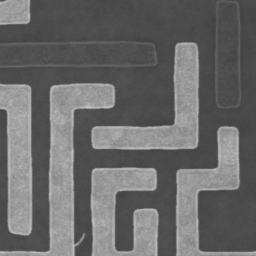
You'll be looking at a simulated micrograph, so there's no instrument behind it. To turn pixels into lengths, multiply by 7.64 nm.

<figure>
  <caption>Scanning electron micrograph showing wiring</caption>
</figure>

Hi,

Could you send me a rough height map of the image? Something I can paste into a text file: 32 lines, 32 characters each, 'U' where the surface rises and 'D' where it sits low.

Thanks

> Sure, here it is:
UUUUDDDDDDDDDDDDDDDDDDDDDDDUUUDD
UUUUDDDDDDDDDDDDDDDDDDDDDDDUUUDD
UUUUDDDDDDDDDDDDDDDDDDDDDDDUUUDD
DDDDDDDDDDDDDDDDDDDDDDDDDDDUUUDD
DDDDDDDDDDDDDDDDDDDDDDDDDDDUUUDD
DDUUUUUUUUUUUUUUUUUDDDDUDDDUUUDD
UUUUUUUUUUUUUUUUUUUDDDUUUDDUUUDD
UUUUUUUUUUUUUUUUUUUUDDUUUDDUUUDD
DDDDDDDDDDDDDDDDDDDDDDUUUDDUUUDD
DDDDDDDDDDDDDDDDDDDDDDUUUDDUUUDD
DDDDDDDDDDDDDDDDDDDDDDUUUDDUUUDD
UUUUDDUUUUUUUUDDDDDDDDUUUDDUUUDD
UUUUDDUUUUUUUUDDDDDDDDUUUDDUUUDD
UUUUDDUUUUDDDDDDDDDDDDUUUDDDDDDD
DUUUDDUUUDDDDDDDDDDDDDUUUDDDDDDD
DUUUDDUUUDDDDDDDDDDDDDUUUDDDDDDD
DUUUDDUUUDDDUUUUUUUUUUUUUDDUUUDD
DUUUDDUUUDDDUUUUUUUUUUUUUDDUUUDD
DUUUDDUUUDDDUUUUUUUUUUUUDDDUUUDD
DUUUDDUUUDDDDDDDDDDDDDDDDDDUUUDD
DUUUDDUUUDDDDDDDDDDDDDDDDDDUUUDD
DUUUDDUUUDDDUUUUUUUDDDUUUUUUUUDD
DUUUDDUUUDDDUUUUUUUUDDUUUUUUUUDD
DUUUDDUUUDDDUUUUUUUDDDUUUUUUUUDD
DUUUDDUUUDDDUUDDDDDDDDUUUDDDDDDD
DUUUDDUUUDDDUUDDDDDDDDUUUDDDDDDD
DUUUDDUUUDDDUUDDDUUUDDUUUDDDDDDD
DUUUDDUUUDDDUUDDDUUUDDUUUDDDDDDD
DUUUDDUUUDDDUUDDDUUUDDUUUDDDDDDD
DDDDDDUUUDDDUUDDDUUUDDUUUDDDDDDD
DDDDDDUUUDDDUUDDDUUUDDUUUDDDDDDD
DUUDDDUUUDDDUUUDUUUUDDUUUUDDDDDD